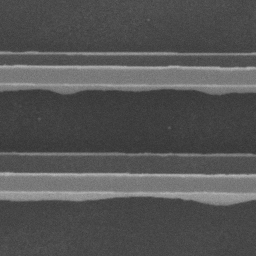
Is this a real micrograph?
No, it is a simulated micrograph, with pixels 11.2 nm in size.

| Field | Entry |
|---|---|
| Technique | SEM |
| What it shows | lines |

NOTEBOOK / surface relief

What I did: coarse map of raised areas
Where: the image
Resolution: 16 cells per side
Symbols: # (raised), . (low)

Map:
................
................
................
################
################
.............#..
................
................
................
................
################
################
................
................
................
................